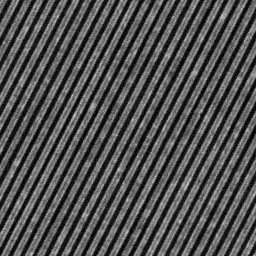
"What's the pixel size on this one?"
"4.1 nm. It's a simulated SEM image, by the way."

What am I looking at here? parallel lines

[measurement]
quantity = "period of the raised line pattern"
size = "43.7 nm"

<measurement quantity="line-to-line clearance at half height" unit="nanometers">24.6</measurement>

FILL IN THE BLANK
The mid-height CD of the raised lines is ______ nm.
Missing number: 21